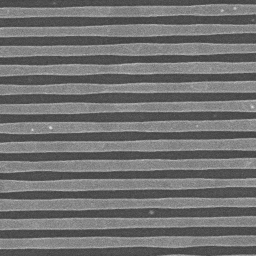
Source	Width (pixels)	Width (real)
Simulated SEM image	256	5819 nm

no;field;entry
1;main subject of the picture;wiring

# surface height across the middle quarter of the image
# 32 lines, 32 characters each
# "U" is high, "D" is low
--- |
UUUUUUUUUUUUUUUUUUUUUUUUUUUUUUUU
UUUUUUUUUUUUUUUUUUUUUUUUUUUUUUUU
UUUUUUDDDDDDDDDDDDDDDDDDDDDDDDDD
DDDDDDDDDDDDDDDDDDDDDDDDDDDDDDDD
DDDDDDDDDDDDDDDDDDDDDDDDDDDDDDDD
UUUUUUUUUUUUUUUUUUUUUUUUUUUUUUUU
UUUUUUUUUUUUUUUUUUUUUUUUUUUUUUUU
DDDDDDDDDDDDDDDDDDDDDDDDDDDDDDDD
DDDDDDDDDDDDDDDDDDDDDDDDDDDDDDDD
DDDDDDDDDDDDDDDDDDDDDDDDDDDDDDDD
UUUUUUUUUUUUUUUUUUUUUUUUUUUUUUUU
UUUUUUUUUUUUUUUUUUUUUUUUUUUUUUUU
DDDDDDDDDDDDDDDDDDDDDDDDDDDDDDDD
DDDDDDDDDDDDDDDDDDDDDDDDDDDDDDDD
DDDDDDDDDDDDDDDDDDDDDDDDDUUUUUUU
UUUUUUUUUUUUUUUUUUUUUUUUUUUUUUUU
UUUUUUUUUUUUUUUUUUUUUUUUUUUUUUUU
DDDDDDDDDDDDDDDDDDDDDDDDDDDDDDDD
DDDDDDDDDDDDDDDDDDDDDDDDDDDDDDDD
UUUUUUUUUUUUUUUUUUUUUUUUUUUUUUUU
UUUUUUUUUUUUUUUUUUUUUUUUUUUUUUUU
UUUUUUUUUUUUUUUUUUUUUUUUUUUUUUUU
DDDDDDDDDDDDDDDDDDDDDDDDDDDDDDDD
DDDDDDDDDDDDDDDDDDDDDDDDDDDDDDDD
UUUUUUUUUUUUUUUUUUUUUUUUUUUUUUUU
UUUUUUUUUUUUUUUUUUUUUUUUUUUUUUUU
UUUUUUUUUUUUUUUUUUUUUUUDDDDDDDDD
DDDDDDDDDDDDDDDDDDDDDDDDDDDDDDDD
DDDDDDDDDDDDDDDDDDDDDDDDDDDDDDDD
UUUUUUUUUUUUUUUUUUUUUUUUUUUUUUUU
UUUUUUUUUUUUUUUUUUUUUUUUUUUUUUUU
UUUUDDDDDDDDDDDDDDDDDDDDDDDDDDDD